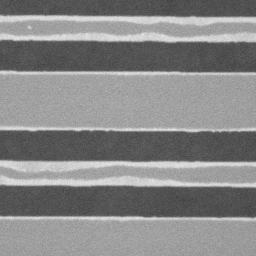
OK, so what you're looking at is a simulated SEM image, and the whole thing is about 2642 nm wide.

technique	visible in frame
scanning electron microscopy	lines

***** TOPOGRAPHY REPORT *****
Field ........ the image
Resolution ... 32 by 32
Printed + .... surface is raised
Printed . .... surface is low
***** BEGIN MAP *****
................................
................................
++++++++++++++++++.+++....++++++
++++++++++++++++++++++++++++++++
++++++++++++++++++++++++++++++++
................................
................................
................................
................................
++++++++++++++++++++++++++++++++
++++++++++++++++++++++++++++++++
++++++++++++++++++++++++++++++++
++++++++++++++++++++++++++++++++
++++++++++++++++++++++++++++++++
++++++++++++++++++++++++++++++++
++++++++++++++++++++++++++++++++
................................
................................
................................
................................
+............++++..........++.++
++++++++++++++++++++++++++++++++
++++++++++++++++++++++++++++++++
................................
................................
................................
................................
++++++++++++++++++++++++++++++++
++++++++++++++++++++++++++++++++
++++++++++++++++++++++++++++++++
++++++++++++++++++++++++++++++++
++++++++++++++++++++++++++++++++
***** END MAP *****